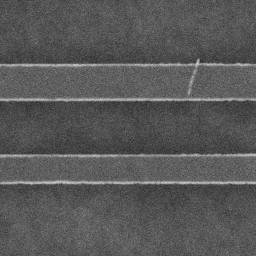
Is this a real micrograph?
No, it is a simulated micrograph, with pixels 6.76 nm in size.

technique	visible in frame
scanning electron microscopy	lines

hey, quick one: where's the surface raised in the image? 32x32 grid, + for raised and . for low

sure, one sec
................................
................................
................................
................................
................................
................................
................................
................................
++++++++++++++++++++++++++++++++
++++++++++++++++++++++++++++++++
++++++++++++++++++++++++++++++++
++++++++++++++++++++++++++++++++
+++++++++++++++++++++++++++++++.
................................
................................
................................
................................
................................
................................
++++++++++++++++++++++++++++++++
++++++++++++++++++++++++++++++++
++++++++++++++++++++++++++++++++
++++++++++++++++++++++++++++++++
................................
................................
................................
................................
................................
................................
................................
................................
................................